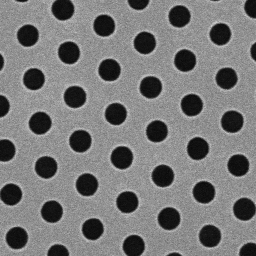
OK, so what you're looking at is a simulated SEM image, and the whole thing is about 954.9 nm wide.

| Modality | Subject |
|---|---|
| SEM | a regular array of holes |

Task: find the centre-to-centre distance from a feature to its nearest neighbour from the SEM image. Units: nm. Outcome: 163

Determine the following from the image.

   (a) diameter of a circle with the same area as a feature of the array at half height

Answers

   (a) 84.1 nanometers